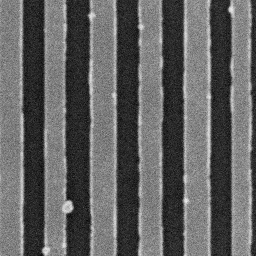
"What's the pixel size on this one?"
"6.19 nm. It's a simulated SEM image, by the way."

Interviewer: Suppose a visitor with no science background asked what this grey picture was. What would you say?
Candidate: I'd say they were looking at lines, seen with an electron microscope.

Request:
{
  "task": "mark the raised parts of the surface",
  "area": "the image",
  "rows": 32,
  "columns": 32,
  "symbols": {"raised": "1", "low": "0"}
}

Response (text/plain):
11100011000111000111000111000110
11100011000111000111000111000110
11100011000111000111000111000110
11100011000111000111000111000110
11100011000111000011000111000110
11100011000111000111000111000110
11100011000111000011000111000110
11100011000111000011000111000110
11100011000111000111000111000110
11100011000111000111000111000110
11100011000111000111000111000110
11100011000111100111000111000110
11100011000111000111000111000110
11100011000111000111000111000110
11100011000111000111000111000110
11100011000111000111000111000110
11100011000111000111000111000110
11100011000111000111000111000110
11100011000111000111000111000110
11100011000111000111000111000110
11100011000111000111000111000110
11100011000111000011000111000110
11100011000111000011000111000110
11100011000111000111000111000110
11100011000111000111000111000110
11100011100111000011000111000110
11100011100111000111000111000110
11100011000011000111000111000110
11100011000011000111000111000110
11100011000111000011000111000110
11100011000111000111000111000110
11100111000111000111000111000110